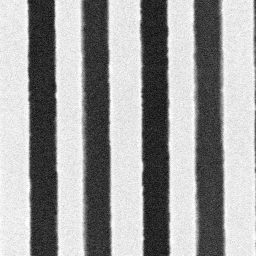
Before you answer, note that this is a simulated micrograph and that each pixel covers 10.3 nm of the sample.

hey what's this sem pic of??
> lines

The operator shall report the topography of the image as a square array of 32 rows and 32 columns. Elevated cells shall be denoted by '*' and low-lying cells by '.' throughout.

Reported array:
***....***....***....***....****
***....***....***....***....****
***....***....***....***....****
***....***....***....***....****
****...***....***....***....****
****...***....***....***....****
***....***....***....***....****
***....***....****...***....****
***....***....****...***....****
****...***....***....***....****
****...***....****...***....****
****...***....****...***....****
****...***....****...***....****
****...***....****...***....****
****...***....****...***....****
****...***....****...***....****
****...***....****...***....****
****...***....****...***....****
****...***....****...***....****
****...***....****...***....****
****...***....****...***....****
****...***....****...***....****
****...***....****...***....****
****...***....****...***....****
****...***....****...***....****
****...***....****...***....****
****...***....****...***....****
****...***....****...***....****
****...***....****...***....****
****...***....****...***....****
****...***....****...***....****
****...***....****...***....****